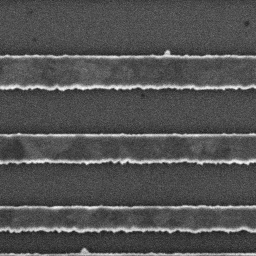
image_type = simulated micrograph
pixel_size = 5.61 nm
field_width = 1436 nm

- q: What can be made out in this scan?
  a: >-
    lines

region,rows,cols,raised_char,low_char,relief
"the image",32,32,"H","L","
LLLLLLLLLLLLLLLLLLLLLLLLLLLLLLLL
LLLLLLLLLLLLLLLLLLLLLLLLLLLLLLLL
LLLLLLLLLLLLLLLLLLLLLLLLLLLLLLLL
LLLLLLLLLLLLLLLLLLLLLLLLLLLLLLLL
LLLLLLLLLLLLLLLLLLLLLLLLLLLLLLLL
LLLLLLLLLLLLLLLLLLLLLLLLLLLLLLLL
LLLLLLLLLLLLLLLLLLLLLLLLLLLLLLLL
HHHHHHHHHHHHHHHHHHHHHHHHHHHHHHHH
HHHHHHHHHHHHHHHHHHHHHHHHHHHHHHHH
HHHHHHHHHHHHHHHHHHHHHHHHHHHHHHHH
HHHHHHHHHHHHHHHHHHHHHHHHHHHHHHHH
LLLLLLLLLLLLLLLLLLLLLLLLLLLLLLLL
LLLLLLLLLLLLLLLLLLLLLLLLLLLLLLLL
LLLLLLLLLLLLLLLLLLLLLLLLLLLLLLLL
LLLLLLLLLLLLLLLLLLLLLLLLLLLLLLLL
LLLLLLLLLLLLLLLLLLLLLLLLLLLLLLLL
LLLLLLLLLLLLLLLLLLLLLLLLLLLLLLLL
HHHHHHHHHHHHHHHHHHHHHHHHHHHHHHHH
HHHHHHHHHHHHHHHHHHHHHHHHHHHHHHHH
HHHHHHHHHHHHHHHHHHHHHHHHHHHHHHHH
LLLLLLLLLLLLLLLLLLLLLLLLLLLLLLLL
LLLLLLLLLLLLLLLLLLLLLLLLLLLLLLLL
LLLLLLLLLLLLLLLLLLLLLLLLLLLLLLLL
LLLLLLLLLLLLLLLLLLLLLLLLLLLLLLLL
LLLLLLLLLLLLLLLLLLLLLLLLLLLLLLLL
LLLLLLLLLLLLLLLLLLLLLLLLLLLLLLLL
HHHHHHHHHHHHHHHHHHHHHHHHHHHHHHHH
HHHHHHHHHHHHHHHHHHHHHHHHHHHHHHHH
HHHHHHHHHHHHHHHHHHHHHHHHHHHHHHHH
LLLLLLLLLLLLLLLLLLLLLLLLLLLLLLLL
LLLLLLLLLLLLLLLLLLLLLLLLLLLLLLLL
LLLLLLLLLLLLLLLLLLLLLLLLLLLLLLLL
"